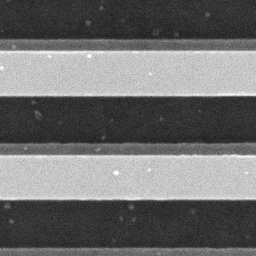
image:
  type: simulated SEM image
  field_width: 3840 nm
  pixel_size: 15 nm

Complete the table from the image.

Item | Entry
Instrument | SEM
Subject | lines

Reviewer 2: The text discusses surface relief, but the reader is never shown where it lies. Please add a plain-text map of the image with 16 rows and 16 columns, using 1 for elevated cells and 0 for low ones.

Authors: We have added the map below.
0000000000000000
0000000000000000
0000000000000000
1111111111111111
1111111111111111
1111111111111111
0000000000000000
0000000000000000
0000000000000000
0000000000000000
1111111111111111
1111111111111111
0000000000000000
0000000000000000
0000000000000000
0000000000000000